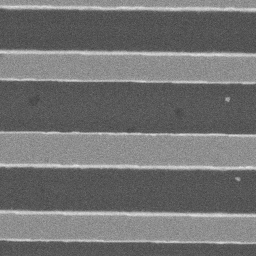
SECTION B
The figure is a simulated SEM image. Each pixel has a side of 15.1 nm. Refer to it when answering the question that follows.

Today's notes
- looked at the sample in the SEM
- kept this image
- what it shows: lines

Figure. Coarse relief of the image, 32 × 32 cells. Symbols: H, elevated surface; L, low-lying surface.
HHHHHHHHHHHHHHHHHHHHHHHHHHHHHHHH
LLLLLLLLLLLLLLLLLLLLLLLLLLLLLLLL
LLLLLLLLLLLLLLLLLLLLLLLLLLLLLLLL
LLLLLLLLLLLLLLLLLLLLLLLLLLLLLLLL
LLLLLLLLLLLLLLLLLLLLLLLLLLLLLLLL
LLLLLLLLLLLLLLLLLLLLLLLLLLLLLLLL
LLLLLLLLLLLLLLLLLLLLLLLLLLLLLLLL
HHHHHHHHHHHHHHHHHHHHHHHHHHHHHHHH
HHHHHHHHHHHHHHHHHHHHHHHHHHHHHHHH
HHHHHHHHHHHHHHHHHHHHHHHHHHHHHHHH
LLLLLLLLLLLLLLLLLLLLLLLLLLLLLLLL
LLLLLLLLLLLLLLLLLLLLLLLLLLLLLLLL
LLLLLLLLLLLLLLLLLLLLLLLLLLLLLLLL
LLLLLLLLLLLLLLLLLLLLLLLLLLLLLLLL
LLLLLLLLLLLLLLLLLLLLLLLLLLLLLLLL
LLLLLLLLLLLLLLLLLLLLLLLLLLLLLLLL
LLLLLLLLLLLLLLLLLLLLLLLLLLLLLLLL
HHHHHHHHHHHHHHHHHHHHHHHHHHHHHHHH
HHHHHHHHHHHHHHHHHHHHHHHHHHHHHHHH
HHHHHHHHHHHHHHHHHHHHHHHHHHHHHHHH
HHHHHHHHHHHHHHHHHHHHHHHHHHHHHHHH
LLLLLLLLLLLLLLLLLLLLLLLLLLLLLLLL
LLLLLLLLLLLLLLLLLLLLLLLLLLLLLLLL
LLLLLLLLLLLLLLLLLLLLLLLLLLLLLLLL
LLLLLLLLLLLLLLLLLLLLLLLLLLLLLLLL
LLLLLLLLLLLLLLLLLLLLLLLLLLLLLLLL
LLLLLLLLLLLLLLLLLLLLLLLLLLLLLLLL
HHHHHHHHHHHHHHHHHHHHHHHHHHHHHHHH
HHHHHHHHHHHHHHHHHHHHHHHHHHHHHHHH
HHHHHHHHHHHHHHHHHHHHHHHHHHHHHHHH
LLLLLLLLLLLLLLLLLLLLLLLLLLLLLLLL
LLLLLLLLLLLLLLLLLLLLLLLLLLLLLLLL